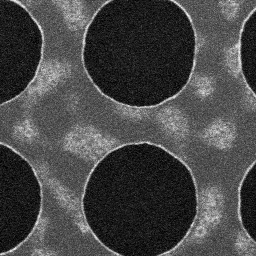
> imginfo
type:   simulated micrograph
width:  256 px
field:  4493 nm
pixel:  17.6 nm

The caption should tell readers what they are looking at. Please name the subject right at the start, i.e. holes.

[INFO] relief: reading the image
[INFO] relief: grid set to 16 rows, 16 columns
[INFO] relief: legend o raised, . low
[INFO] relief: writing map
.ooooo.....ooooo
..oooo......ooo.
...oo.......ooo.
...oo.......ooo.
..ooo.......ooo.
..oooo.....ooooo
oooooooo..oooooo
oooooooooooooooo
oooooooooooooooo
.oooooo...oooooo
..oooo......oooo
..ooo.......ooo.
...oo.......ooo.
..ooo.......ooo.
..oooo......ooo.
.oooooo....ooooo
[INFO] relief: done